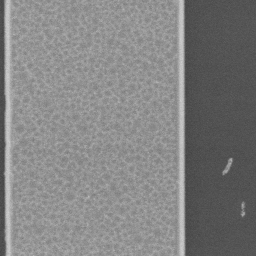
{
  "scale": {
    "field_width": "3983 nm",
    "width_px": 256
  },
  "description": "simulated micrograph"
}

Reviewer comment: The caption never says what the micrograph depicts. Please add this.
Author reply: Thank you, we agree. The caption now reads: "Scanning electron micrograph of one or a few lines or trenches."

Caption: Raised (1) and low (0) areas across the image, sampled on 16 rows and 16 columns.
0111111111100000
0111111111100000
0111111111100000
0111111111100000
0111111111100000
0111111111100000
0111111111100000
0111111111100000
0111111111100000
1111111111100000
0111111111100000
0111111111100000
0111111111100000
0111111111100000
0111111111100000
0111111111100000